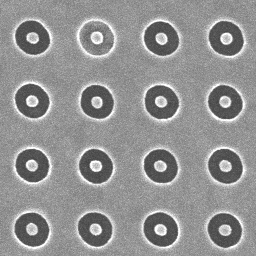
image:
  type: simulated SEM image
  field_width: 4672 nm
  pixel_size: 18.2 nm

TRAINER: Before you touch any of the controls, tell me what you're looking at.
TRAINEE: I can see a regular array of ring-shaped grooves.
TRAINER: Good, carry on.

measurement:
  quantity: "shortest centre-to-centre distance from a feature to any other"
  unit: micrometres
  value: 1.16